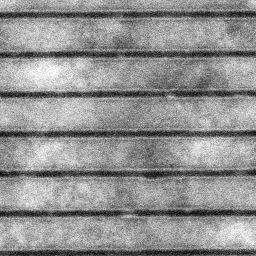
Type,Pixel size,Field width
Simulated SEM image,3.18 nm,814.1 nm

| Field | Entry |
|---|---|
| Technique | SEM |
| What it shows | parallel lines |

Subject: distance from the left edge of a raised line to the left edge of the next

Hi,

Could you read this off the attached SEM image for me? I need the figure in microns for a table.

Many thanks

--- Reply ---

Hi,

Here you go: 0.126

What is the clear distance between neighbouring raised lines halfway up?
95.4 nanometers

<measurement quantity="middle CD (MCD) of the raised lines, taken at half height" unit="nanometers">30.6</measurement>